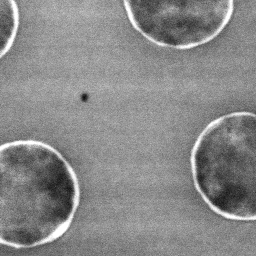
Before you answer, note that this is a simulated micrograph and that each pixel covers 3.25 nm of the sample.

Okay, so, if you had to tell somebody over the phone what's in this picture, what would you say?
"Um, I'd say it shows raised bodies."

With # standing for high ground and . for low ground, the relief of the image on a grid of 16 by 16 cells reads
#.......######..
#.......######..
#........####...
................
................
................
................
..............##
.............###
###.........####
####........####
#####.......####
#####........###
####..........##
####............
................